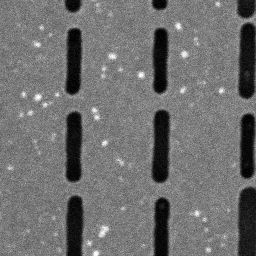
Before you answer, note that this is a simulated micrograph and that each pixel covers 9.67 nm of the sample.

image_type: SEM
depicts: holes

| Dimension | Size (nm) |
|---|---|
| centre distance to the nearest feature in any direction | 826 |